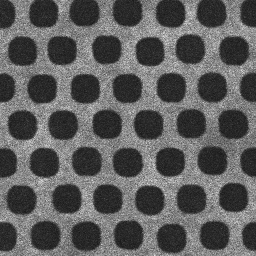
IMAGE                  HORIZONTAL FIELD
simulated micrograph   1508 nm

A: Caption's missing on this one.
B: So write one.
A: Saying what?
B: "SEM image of a regular array of holes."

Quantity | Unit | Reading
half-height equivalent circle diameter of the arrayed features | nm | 178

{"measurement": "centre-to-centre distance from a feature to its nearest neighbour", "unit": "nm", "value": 242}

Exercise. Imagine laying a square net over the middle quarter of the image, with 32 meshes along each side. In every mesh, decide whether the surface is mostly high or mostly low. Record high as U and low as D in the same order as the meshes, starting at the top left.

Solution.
UUUUUUUUUUUUUUUUUUUUDDDUUUUUUUUU
UUUUUUUUUUUUUUUUUUUUUUUUUUUUUUUU
UUUUDDUUUUUUUUUDDUUUUUUUUDDDDUUU
UUDDDDDDUUUUUDDDDDDUUUUUDDDDDDUU
UUDDDDDDDUUUDDDDDDDUUUUDDDDDDDUU
UUDDDDDDDUUUDDDDDDDDUUUDDDDDDDDU
UUDDDDDDDUUUDDDDDDDDUUUDDDDDDDDU
UUDDDDDDDUUUDDDDDDDUUUUDDDDDDDUU
UUDDDDDDDUUUUDDDDDDUUUUUDDDDDDUU
UUUUDDDDUUUUUUDDDDUUUUUUUDDDDUUU
UUUUUUUUUUUUUUUUUUUUUUUUUUUUUUUU
UUUUUUUUUDDUUUUUUUUUUUUUUUUUUUDD
DDDUUUUUDDDDDDUUUUDDDDDDUUUUUDDD
DDDUUUUDDDDDDDUUUUDDDDDDDUUUDDDD
DDDUUUUDDDDDDDUUUDDDDDDDDUUUDDDD
DDDUUUUDDDDDDDUUUDDDDDDDDUUUDDDD
DDDUUUUDDDDDDDUUUUDDDDDDDUUUDDDD
DDDUUUUUDDDDDDUUUUDDDDDDUUUUUDDD
DDUUUUUUUDDDDUUUUUUDDDDUUUUUUUDD
UUUUUUUUUUUUUUUUUUUUUUUUUUUUUUUU
UUUUUUUUUUUUUUUUUUUUUUUUUUUUUUUU
UUUDDDDDUUUUUUDDDDUUUUUUDDDDDUUU
UUDDDDDDDUUUDDDDDDDUUUUDDDDDDDUU
UUDDDDDDDUUUDDDDDDDDUUUDDDDDDDUU
UUDDDDDDDUUUDDDDDDDDUUUDDDDDDDUU
UUDDDDDDDUUUDDDDDDDDUUUDDDDDDDUU
UUDDDDDDDUUUUDDDDDDDUUUDDDDDDDUU
UUUDDDDDUUUUUDDDDDDUUUUUDDDDDUUU
UUUUUUUUUUUUUUUUUUUUUUUUUUUUUUUU
UUUUUUUUUUUUUUUUUUUUUUUUUUUUUUUU
DDDUUUUUUDDDDUUUUUUUDDDUUUUUUUDD
DDDDUUUUDDDDDDUUUUDDDDDDUUUUUDDD